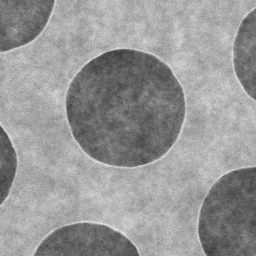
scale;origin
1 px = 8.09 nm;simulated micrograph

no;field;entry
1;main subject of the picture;holes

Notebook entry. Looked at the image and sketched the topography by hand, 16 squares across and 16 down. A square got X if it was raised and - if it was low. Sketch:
---XXXXXXXXXXXXX
---XXXXXXXXXXXX-
--XXXXXXXXXXXXX-
XXXXXX----XXXXX-
XXXXX------XXXX-
XXXX-------XXXX-
XXXX--------XXXX
XXXX-------XXXXX
-XXXX------XXXXX
-XXXX-----XXXXXX
-XXXXXXXXXXXXXX-
-XXXXXXXXXXXX---
XXXXXXXXXXXXX---
XXXXXXXXXXXX----
XXX----XXXXX----
XX------XXXXX---